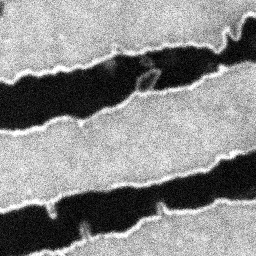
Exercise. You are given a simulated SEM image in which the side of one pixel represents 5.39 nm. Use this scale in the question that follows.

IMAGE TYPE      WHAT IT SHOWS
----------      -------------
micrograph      one or a few lines or trenches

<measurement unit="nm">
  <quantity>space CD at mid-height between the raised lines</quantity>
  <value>415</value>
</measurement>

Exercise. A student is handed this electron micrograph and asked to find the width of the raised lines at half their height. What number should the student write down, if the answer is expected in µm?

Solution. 0.25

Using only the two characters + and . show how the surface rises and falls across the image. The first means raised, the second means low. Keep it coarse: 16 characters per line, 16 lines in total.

................
...............+
..............++
.......+++++++++
.+++++++++++++..
++++++++++++....
++++++++........
++++.+..........
................
...............+
.............+++
.......+++++++++
...+++++++++++++
++++++++++......
++++++++........
+++++...........